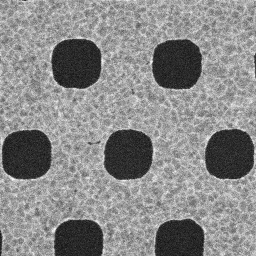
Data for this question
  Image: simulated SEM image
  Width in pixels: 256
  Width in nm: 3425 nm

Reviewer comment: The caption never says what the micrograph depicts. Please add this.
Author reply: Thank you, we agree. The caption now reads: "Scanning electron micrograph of holes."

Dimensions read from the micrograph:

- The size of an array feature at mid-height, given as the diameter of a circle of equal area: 708 nm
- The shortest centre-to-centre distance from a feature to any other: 101 px